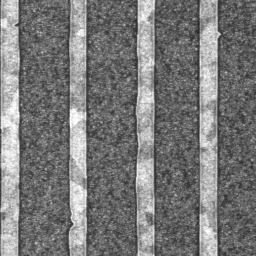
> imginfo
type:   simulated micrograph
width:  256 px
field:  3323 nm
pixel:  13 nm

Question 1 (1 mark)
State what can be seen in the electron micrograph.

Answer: one or a few lines or trenches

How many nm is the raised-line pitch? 860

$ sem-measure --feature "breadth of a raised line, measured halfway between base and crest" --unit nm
204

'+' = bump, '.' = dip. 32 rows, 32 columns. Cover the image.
++.......++......++......++.....
++.......++......++......++.....
++.......++......++......++.....
++.......++......++......++.....
++.......++......++......++.....
++.......++......++......++.....
++.......++......++......++.....
++.......++......++......++.....
++.......++......++......++.....
++.......++......++......++.....
++.......++......++......++.....
++.......++......++......++.....
++.......++......++......++.....
++.......++......++......++.....
++.......++......++......++.....
++.......++......++......++.....
++.......++......++......++.....
++.......++......++......++.....
++.......++......++......++.....
++.......++......++......++.....
++.......++......++......++.....
++.......++......++......++.....
++.......++......++......++.....
++.......++......++......++.....
++.......++......++......++.....
++.......++......++......++.....
++.......++......++......++.....
++.......++......++......++.....
++.......++......++......++.....
++.......++......++......++.....
++.......++......++......++.....
++.......++......++......++.....